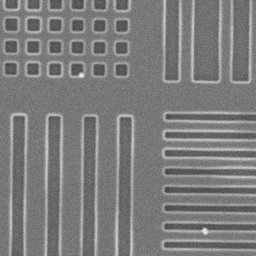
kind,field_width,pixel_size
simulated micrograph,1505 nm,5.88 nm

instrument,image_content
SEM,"groups of lines, slits or small figures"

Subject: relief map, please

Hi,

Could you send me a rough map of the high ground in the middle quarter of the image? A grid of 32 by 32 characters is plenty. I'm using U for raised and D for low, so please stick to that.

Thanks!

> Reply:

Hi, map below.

UUDDDUUDDDUUUDDDUUUUUUUUUDDDDUUU
UUDDDUUDDDUUUDDDUUUUUUUUUDDDDUUU
UUDDUUUDDDUUUDDDUUUUUUUUUDDDDUUU
UUUUUUUUUUUUUUUUUUUUUUUUUDDDDUUU
UUUUUUUUUUUUUUUUUUUUUUUUUUUUUUUU
UUUUUUUUUUUUUUUUUUUUUUUUUUUUUUUU
UUUUUUUUUUUUUUUUUUUUUUUUUUUUUUUU
UUUUUUUUUUUUUUUUUUUUUUUUUUUUUUUU
UUUUUUUUUUUUUUUUUUUUUUUUUUUUUUUU
UUUUUUUUUUUUUUUUUUUUUUUUUUUUUUUU
UUUUUUUUUUUUUUUUUUUUUUUUUUUUUUUU
UUUUUUUUUUUUUUUUUUUUUUUUUUUUUUUU
UUUUUUUUUUUUUUUUUUUUUUUUUDDDDDDD
UUUUUDDDUUUUUUDDDUUUUUUUUDDDDDDD
UUUUUDDDUUUUUUDDDUUUUUUUUUUUUUUU
UUUUUDDDUUUUUUDDDUUUUUUUUUUUUUUU
UUUUUDDDUUUUUUDDDUUUUUUUUUUUUUUU
UUUUUDDDUUUUUUDDDUUUUUUUUDDDDDDD
UUUUUDDDUUUUUUDDDUUUUUUUUDDDDDDD
UUUUUDDDUUUUUUDDDUUUUUUUUUUUUUUU
UUUUUDDDUUUUUUDDDUUUUUUUUUUUUUUU
UUUUUDDDUUUUUUDDDUUUUUUUUDDDDDDD
UUUUUDDDUUUUUUDDDUUUUUUUUDDDDDDD
UUUUUDDDUUUUUUDDDUUUUUUUUUUUUUUU
UUUUUDDDUUUUUUDDDUUUUUUUUUUUUUUU
UUUUUDDDUUUUUUDDDUUUUUUUUUUUUUUU
UUUUUDDDUUUUUUDDDUUUUUUUUDDDDDDD
UUUUUDDDUUUUUUDDDUUUUUUUUDDDDDDD
UUUUUDDDUUUUUDDDDUUUUUUUUUUUUUUU
UUUUUDDDUUUUUDDDDUUUUUUUUUUUUUUU
UUUUUDDDUUUUUDDDDUUUUUUUUUUUUUUU
UUUUUDDDUUUUUDDDDUUUUUUUUDDDDDDD